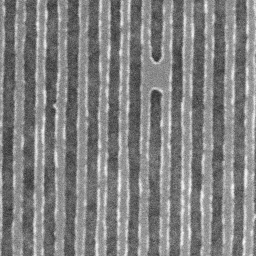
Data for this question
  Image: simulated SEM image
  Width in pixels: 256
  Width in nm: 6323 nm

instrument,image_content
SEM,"parallel lines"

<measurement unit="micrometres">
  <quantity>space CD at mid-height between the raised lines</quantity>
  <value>0.303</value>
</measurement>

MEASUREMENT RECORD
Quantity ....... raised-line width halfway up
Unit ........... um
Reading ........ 0.21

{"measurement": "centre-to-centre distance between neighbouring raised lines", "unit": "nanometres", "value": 519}